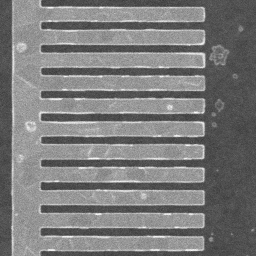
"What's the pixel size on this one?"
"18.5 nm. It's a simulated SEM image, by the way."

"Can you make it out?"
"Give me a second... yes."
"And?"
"groups of lines, slits or small figures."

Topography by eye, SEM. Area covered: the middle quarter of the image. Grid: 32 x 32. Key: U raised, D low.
UUUUUUUUUUUUUUUUUUUUUUUUUUUUUUUU
DDDDDDDDDDDDDDDDDDDDDDDDDDDDDDDD
DDDDDDDDDDDDDDDDDDDDDDDDDDDDDDDD
UUUUUUUUUUUUUUUUUUUUUUUUUUUUUUUU
UUUUUUUUUUUUUUUUUUUUUUUUUUUUUUUU
UUUUUUUUUUUUUUUUUUUUUUUUUUUUUUUU
DDDDDDDDDDDDDDDDDDDDDDDDDDDDDDDD
DDDDDDDDDDDDDDDDDDDDDDDDDDDDDDDD
DDDDDDDDDDDDDDDDDDDDDDDDDDDDDDDD
UUUUUUUUUUUUUUUUUUUUUUUUUUUUUUUU
UUUUUUUUUUUUUUUUUUUUUUUUUUUUUUUU
UUUUUUUUUUUUUUUUUUUUUUUUUUUUUUUU
DDDDDDDDDDDDDDDDDDDDDDDDDDDDDDDD
DDDDDDDDDDDDDDDDDDDDDDDDDDDDDDDD
DDDDDDDDDDUUDDDDDDDDDUUUUUUUUDDD
UUUUUUUUUUUUUUUUUUUUUUUUUUUUUUUU
UUUUUUUUUUUUUUUUUUUUUUUUUUUUUUUU
UUUUUUUUUUUUUUUUUUUUUUUUUUUUUUUU
DDDDDDDDDDDDDDDDDDDDDDDDDDDDDDDD
DDDDDDDDDDDDDDDDDDDDDDDDDDDDDDDD
UUUUUUUUUUUUUUUUUUUUUUUUUUUUUUUU
UUUUUUUUUUUUUUUUUUUUUUUUUUUUUUUU
UUUUUUUUUUUUUUUUUUUUUUUUUUUUUUUU
UUUUUUUUUUUUUUUUUUUUUUUUUUUUUUUU
DDDDDDDDDDDDDDDDDDDDDDDDDDDDDDDD
DDDDDDDDDDDDDDDDDDDDDDDDDDDDDDDD
UUUUUUUUUUUUUUUUUUUUUUUUUUUUUUUU
UUUUUUUUUUUUUUUUUUUUUUUUUUUUUUUU
UUUUUUUUUUUUUUUUUUUUUUUUUUUUUUUU
DDDDDDDDDDDDDDDDDDDUUUUDDDDDUDUU
DDDDDDDDDDDDDDDDDDDDDDDDDDDDDDDD
DDDDDDDDDDDDDDDDDDDDDDDDDDDDDDDD